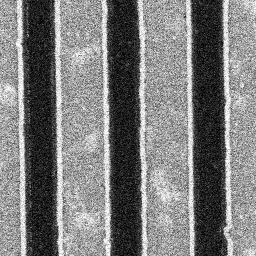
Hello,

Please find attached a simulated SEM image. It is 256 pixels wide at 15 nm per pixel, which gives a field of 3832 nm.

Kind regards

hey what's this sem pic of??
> one or a few lines or trenches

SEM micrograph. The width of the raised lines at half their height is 558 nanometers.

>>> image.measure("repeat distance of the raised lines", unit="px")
84.3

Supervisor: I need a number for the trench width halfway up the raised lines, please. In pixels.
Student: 46.9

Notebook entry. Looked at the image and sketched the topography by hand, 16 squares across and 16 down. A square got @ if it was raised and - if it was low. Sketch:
-@@@---@@---@@--
-@@@---@@---@@--
-@@@---@@---@@--
-@@@---@@---@@--
-@@@---@@---@@--
-@@@---@@---@@--
-@@@---@@---@@--
-@@@---@@---@@--
-@@@---@@---@@--
-@@@---@@---@@--
-@@@---@@---@@--
-@@@---@@---@@--
-@@@---@@---@@--
-@@@---@@---@@--
-@@@---@@---@@--
-@@@---@@---@@--